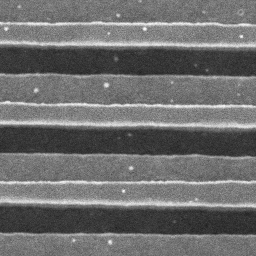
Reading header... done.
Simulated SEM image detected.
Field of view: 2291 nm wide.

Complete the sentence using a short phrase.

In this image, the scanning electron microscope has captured lines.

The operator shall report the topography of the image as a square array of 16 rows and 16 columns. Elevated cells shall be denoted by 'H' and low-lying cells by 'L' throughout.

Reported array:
HHHHHHHHHHHHHHHH
HHHHHHHHHHHHHHHH
HHHHHHHHHHHHHHHH
LLLLLLLLLLLLLLLL
LLLLLLLLLLLLLLLL
HHHHHHHHHHHHHHHH
HHHHHHHHHHHHHHHH
HHHHHHHHHHHHHHHH
LLLLLLLLLLLLLLLL
LLLLLLLLLLLLLLLL
HHHHHHHHHHHHHHHH
HHHHHHHHHHHHHHHH
HHHHHHHHHHHHHHHH
LLLLLLLLLLLLLLLL
LLLLLLLLLLLLLLLL
HHHHHHHHHHHHHHHH